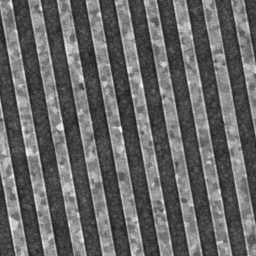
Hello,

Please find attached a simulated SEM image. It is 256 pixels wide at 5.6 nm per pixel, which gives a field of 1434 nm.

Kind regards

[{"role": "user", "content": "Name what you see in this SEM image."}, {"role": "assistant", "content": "parallel lines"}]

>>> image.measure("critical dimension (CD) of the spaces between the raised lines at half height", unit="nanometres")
96.4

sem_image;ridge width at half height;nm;63.3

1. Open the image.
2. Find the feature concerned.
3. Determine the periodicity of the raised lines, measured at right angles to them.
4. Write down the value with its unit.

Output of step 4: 160 nm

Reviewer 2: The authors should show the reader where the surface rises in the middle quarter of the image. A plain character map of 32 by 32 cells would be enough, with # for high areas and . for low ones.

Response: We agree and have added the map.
.###.....##.....###....###....##
..##.....###....###....###.....#
..###....###....###....###.....#
..###....###....###.....###....#
..###....###.....##.....###....#
..###....###.....##.....###....#
..###.....##.....###....###....#
...###....###....###....###.....
...###....###....###.....##.....
...###....###....###.....###....
...###....###.....##.....###....
...###.....##.....###....###....
....##.....##.....###....###....
....###....###....###....###....
....###....###....###.....###...
....###....###.....##.....###...
....###....###.....##.....###...
....###.....##.....###....###...
.....###....###....###....###...
.....###....###....###.....##...
.....###....###....###.....###..
#....###....###.....##.....###..
#....###.....##.....###....###..
#....###.....##.....###....###..
#.....###....###....###....###..
#.....###....###....###.....###.
##....###....###.....##.....###.
##....###....###.....##.....###.
##....###.....##.....###....###.
##.....###....###....###....###.
##.....###....###....###....###.
##.....###....###....###.....###